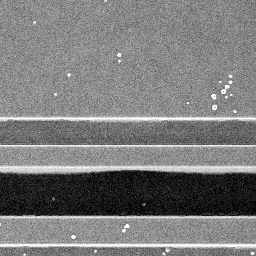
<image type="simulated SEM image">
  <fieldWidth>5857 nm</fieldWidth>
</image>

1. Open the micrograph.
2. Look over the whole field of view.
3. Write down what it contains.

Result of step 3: lines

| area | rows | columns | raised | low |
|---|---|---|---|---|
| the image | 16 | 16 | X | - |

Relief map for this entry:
XXXXXXXXXXXXXXXX
XXXXXXXXXXXXXXXX
XXXXXXXXXXXXXXXX
XXXXXXXXXXXXXXXX
XXXXXXXXXXXXXXXX
XXXXXXXXXXXXXXXX
XXXXXXXXXXXXXXXX
XXXXXXXXXXXXXXXX
XXXXXXXXXXXXXXXX
XXXXXXXXXXXXXXXX
----------------
----------------
----------------
----------------
XXXXXXXXXXXXXXXX
XXXXXXXXXXXXXXXX